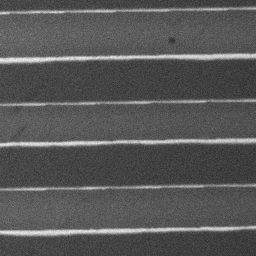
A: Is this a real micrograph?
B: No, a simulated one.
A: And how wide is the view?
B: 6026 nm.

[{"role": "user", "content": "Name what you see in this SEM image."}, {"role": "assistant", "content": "lines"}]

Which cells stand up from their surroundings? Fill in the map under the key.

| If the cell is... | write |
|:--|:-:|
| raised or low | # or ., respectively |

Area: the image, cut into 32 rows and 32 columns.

################################
########........................
................................
................................
................................
................................
................................
....############################
################################
################################
################################
################################
################################
................................
................................
................................
................................
................................
################################
################################
################################
################################
################################
##############..................
................................
................................
................................
................................
.............................###
################################
################################
################################